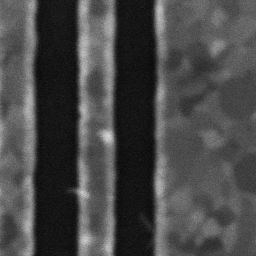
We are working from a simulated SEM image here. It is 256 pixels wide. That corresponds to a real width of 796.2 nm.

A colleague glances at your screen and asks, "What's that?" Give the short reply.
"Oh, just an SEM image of one or a few lines or trenches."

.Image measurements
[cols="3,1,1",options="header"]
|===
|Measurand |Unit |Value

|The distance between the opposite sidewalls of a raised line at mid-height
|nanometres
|97.8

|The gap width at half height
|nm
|148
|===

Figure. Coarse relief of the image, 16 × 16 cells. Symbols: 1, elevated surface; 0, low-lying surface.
1100011000111111
1100011000111111
1100011000111111
1100011000111111
1100011000111111
1100011000111111
1100011000111111
1100011000111111
1100011000111111
1100011000111111
1100011000111111
1100011000111111
1100011000111111
1100011000111111
1100011000111111
1100011000111111